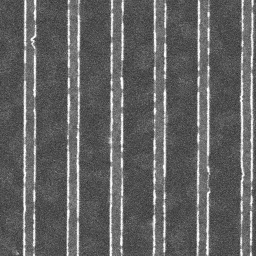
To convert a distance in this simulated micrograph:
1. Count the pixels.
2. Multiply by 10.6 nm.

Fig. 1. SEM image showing parallel lines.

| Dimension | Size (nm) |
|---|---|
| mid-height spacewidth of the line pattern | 92.9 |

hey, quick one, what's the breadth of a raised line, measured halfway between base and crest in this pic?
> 366 nm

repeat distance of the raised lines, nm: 461